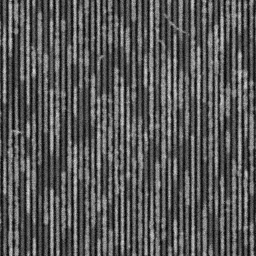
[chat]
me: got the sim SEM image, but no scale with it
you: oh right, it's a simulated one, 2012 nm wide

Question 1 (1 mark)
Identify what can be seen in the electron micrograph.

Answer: parallel lines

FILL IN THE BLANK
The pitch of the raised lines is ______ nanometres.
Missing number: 46.2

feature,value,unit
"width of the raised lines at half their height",21.6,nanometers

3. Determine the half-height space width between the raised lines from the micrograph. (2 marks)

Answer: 25.6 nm